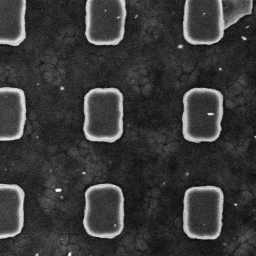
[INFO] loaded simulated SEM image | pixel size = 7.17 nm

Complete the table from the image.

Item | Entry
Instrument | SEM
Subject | raised bodies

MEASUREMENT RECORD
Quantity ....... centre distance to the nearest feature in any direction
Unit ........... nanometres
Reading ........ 694